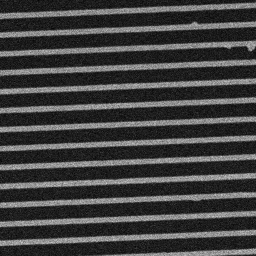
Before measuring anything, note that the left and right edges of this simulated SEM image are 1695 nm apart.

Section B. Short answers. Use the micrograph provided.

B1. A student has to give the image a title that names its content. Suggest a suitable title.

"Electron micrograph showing parallel lines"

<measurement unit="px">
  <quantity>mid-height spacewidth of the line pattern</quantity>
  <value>13.9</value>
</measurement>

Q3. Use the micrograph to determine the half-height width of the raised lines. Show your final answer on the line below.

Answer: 4.62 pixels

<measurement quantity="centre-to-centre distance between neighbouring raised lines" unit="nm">125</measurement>